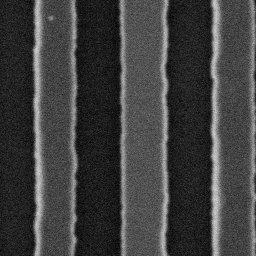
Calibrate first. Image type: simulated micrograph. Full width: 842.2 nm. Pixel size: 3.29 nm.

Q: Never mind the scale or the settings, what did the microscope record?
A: lines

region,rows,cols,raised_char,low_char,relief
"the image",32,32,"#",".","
....#####......######......#####
....#####......######......#####
....#####......######......#####
....#####......######......#####
....#####......######......#####
....#####......######......#####
....#####......######......#####
....#####......######......#####
....#####......######.....######
....#####......######.....######
....######.....######......#####
....#####......######......#####
....#####......######......#####
....#####......######......#####
....#####......######......#####
....#####......######......#####
....#####......######.....######
....#####......######......#####
....#####......######......#####
....#####......######......#####
.....#####.....######......#####
.....####......######......#####
.....####......######......#####
.....####......######......#####
.....####......######......#####
.....####......######......#####
.....####......######......#####
....#####......######......#####
....#####......######......#####
....#####......######......#####
.....####......######......#####
....#####......######......#####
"